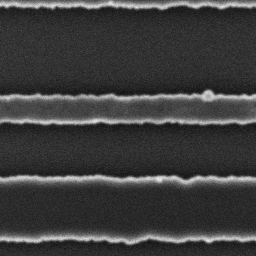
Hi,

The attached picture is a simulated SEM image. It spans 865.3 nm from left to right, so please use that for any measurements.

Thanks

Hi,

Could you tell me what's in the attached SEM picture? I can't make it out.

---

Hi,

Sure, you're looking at lines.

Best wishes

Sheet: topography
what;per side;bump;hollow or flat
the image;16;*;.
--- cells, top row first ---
................
................
................
................
................
................
****************
****************
................
................
................
****************
****************
****************
****************
................